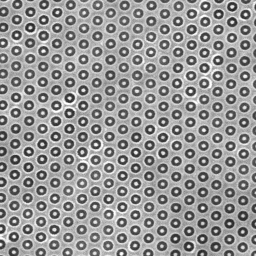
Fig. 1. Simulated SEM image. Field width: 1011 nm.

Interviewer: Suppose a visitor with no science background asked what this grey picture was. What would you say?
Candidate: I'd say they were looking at a regular array of ring-shaped grooves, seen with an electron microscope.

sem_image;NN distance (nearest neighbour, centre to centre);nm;60.1